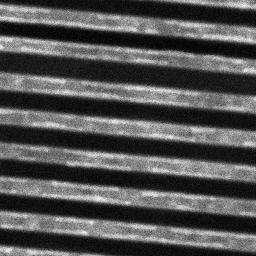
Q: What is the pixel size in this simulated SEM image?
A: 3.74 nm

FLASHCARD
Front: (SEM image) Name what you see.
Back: parallel lines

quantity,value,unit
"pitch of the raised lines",0.129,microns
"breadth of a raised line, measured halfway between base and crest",67.5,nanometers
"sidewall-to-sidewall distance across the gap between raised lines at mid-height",61.2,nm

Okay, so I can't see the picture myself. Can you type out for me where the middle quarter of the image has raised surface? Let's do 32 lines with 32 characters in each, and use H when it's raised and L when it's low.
LLLLLLLLLLLLLLLLLLLLLLLLLHHHHHHH
LLLLLLLLLLLLLLLLLLLLLLLLLLLLLLLL
LLLLLLLLLLLLLLLLLLLLLLLLLLLLLLLL
LLLLLLLLLLLLLLLLLLLLLLLLLLLLLLLL
HHHHHHHHHHLLLLLLLLLLLLLLLLLLLLLL
HHHHHHHHHHHHHHHHHHHHHLLLLLLLLLLL
HHHHHHHHHHHHHHHHHHHHHHHHHHHHHHHL
HHHHHHHHHHHHHHHHHHHHHHHHHHHHHHHH
LLLLLLHHHHHHHHHHHHHHHHHHHHHHHHHH
LLLLLLLLLLLLLLLLLHHHHHHHHHHHHHHH
LLLLLLLLLLLLLLLLLLLLLLLLLLLLHHHH
LLLLLLLLLLLLLLLLLLLLLLLLLLLLLLLL
HLLLLLLLLLLLLLLLLLLLLLLLLLLLLLLL
HHHHHHHHHHHHLLLLLLLLLLLLLLLLLLLL
HHHHHHHHHHHHHHHHHHHHHHLLLLLLLLLL
HHHHHHHHHHHHHHHHHHHHHHHHHHHHHHHH
HHHHHHHHHHHHHHHHHHHHHHHHHHHHHHHH
LLLLLLLLLLHHHHHHHHHHHHHHHHHHHHHH
LLLLLLLLLLLLLLLLLLLLLHHHHHHHHHHH
LLLLLLLLLLLLLLLLLLLLLLLLLLLLLLLH
LLLLLLLLLLLLLLLLLLLLLLLLLLLLLLLL
HHHHHLLLLLLLLLLLLLLLLLLLLLLLLLLL
HHHHHHHHHHHHHHHLLLLLLLLLLLLLLLLL
HHHHHHHHHHHHHHHHHHHHHHHHHHHHLLLL
HHHHHHHHHHHHHHHHHHHHHHHHHHHHHHHH
LLLHHHHHHHHHHHHHHHHHHHHHHHHHHHHH
LLLLLLLLLLLLLLHHHHHHHHHHHHHHHHHH
LLLLLLLLLLLLLLLLLLLLLLLLHHHHHHHH
LLLLLLLLLLLLLLLLLLLLLLLLLLLLLLLL
LLLLLLLLLLLLLLLLLLLLLLLLLLLLLLLL
HHHHHHHHHHLLLLLLLLLLLLLLLLLLLLLL
HHHHHHHHHHHHHHHHHHHHHLLLLLLLLLLL